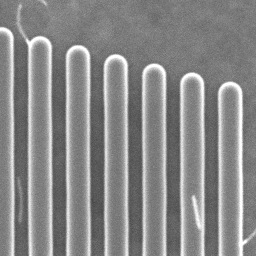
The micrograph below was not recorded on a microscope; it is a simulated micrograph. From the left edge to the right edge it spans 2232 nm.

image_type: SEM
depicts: groups of lines, slits or small figures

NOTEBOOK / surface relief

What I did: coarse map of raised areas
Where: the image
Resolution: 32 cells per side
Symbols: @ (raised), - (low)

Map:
--------------------------------
--------------------------------
--------------------------------
--------------------------------
@-------------------------------
@@--@@--------------------------
@@--@@---@@---------------------
@@--@@--@@@--@@-----------------
@@--@@--@@@--@@@--@@------------
@@--@@--@@@--@@@--@@@--@@-------
@@--@@--@@@--@@@--@@@--@@---@---
@@--@@--@@@--@@@--@@@--@@--@@@--
@@--@@--@@@--@@@--@@@--@@--@@@--
@@--@@--@@@--@@@--@@@--@@--@@@--
@@--@@--@@@--@@@--@@@--@@--@@@--
@@--@@--@@@--@@@--@@@--@@--@@@--
@@--@@--@@@--@@@--@@@--@@--@@@--
@@--@@--@@@--@@@--@@@--@@--@@@--
@@--@@--@@@--@@@--@@@--@@--@@@--
@@--@@--@@@--@@@--@@@--@@--@@@--
@@--@@--@@@--@@@--@@@--@@--@@@--
@@--@@--@@@--@@@--@@@--@@--@@@--
@@--@@--@@@--@@@--@@@--@@--@@@--
@@--@@--@@@--@@@--@@@--@@--@@@--
@@--@@--@@@--@@@--@@@--@@--@@@--
@@--@@--@@@--@@@--@@@--@@--@@@--
@@--@@--@@@--@@@--@@@--@@--@@@--
@@--@@--@@@--@@@--@@@--@@--@@@--
@@--@@--@@@--@@@--@@@--@@--@@@--
@@--@@--@@@--@@@--@@@--@@--@@@--
@@--@@--@@@--@@@--@@@--@@---@@--
@@--@@--@@@--@@@--@@@--@@---@@--